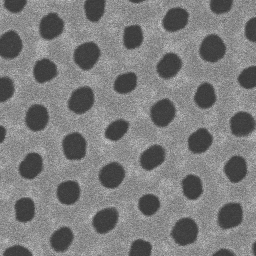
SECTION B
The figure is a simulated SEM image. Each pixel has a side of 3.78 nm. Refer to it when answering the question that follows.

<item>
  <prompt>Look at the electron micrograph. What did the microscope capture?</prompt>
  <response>a regular array of holes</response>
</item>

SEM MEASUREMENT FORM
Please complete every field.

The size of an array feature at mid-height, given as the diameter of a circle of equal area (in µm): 0.0921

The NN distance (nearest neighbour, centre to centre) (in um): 0.172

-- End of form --